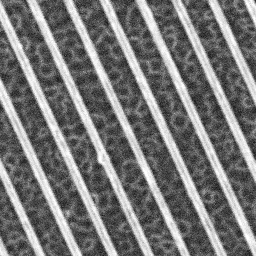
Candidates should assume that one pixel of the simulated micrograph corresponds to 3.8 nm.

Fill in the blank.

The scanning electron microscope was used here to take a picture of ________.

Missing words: parallel lines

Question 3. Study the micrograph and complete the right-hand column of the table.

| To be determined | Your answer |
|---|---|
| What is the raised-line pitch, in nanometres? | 125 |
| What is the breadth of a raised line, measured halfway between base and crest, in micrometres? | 0.0311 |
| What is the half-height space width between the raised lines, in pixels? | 24.6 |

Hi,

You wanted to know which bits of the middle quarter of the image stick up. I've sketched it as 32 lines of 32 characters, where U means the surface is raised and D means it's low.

UDDDDDDDUUDDDDDDDUUDDDDDDDUUDDDD
UDDDDDDDUUDDDDDDDUUDDDDDDDUUDDDD
UDDDDDDDDUDDDDDDDDUUDDDDDDDUUDDD
UUDDDDDDDUUDDDDDDDUUDDDDDDDUUDDD
UUDDDDDDDUUDDDDDDDUUUDDDDDDUUUDD
DUUDDDDDDDUUDDDDDDDUUDDDDDDDUUDD
DUUDDDDDDDUUDDDDDDDUUUDDDDDDUUUD
DDUUDDDDDDDUUDDDDDDDUUDDDDDDDUUD
DDUUDDDDDDDUUDDDDDDDUUDDDDDDDUUD
DDDUUDDDDDDDUUDDDDDDDUUDDDDDDDUU
DDDUUDDDDDDDUUDDDDDDDUUDDDDDDDUU
DDDUUUDDDDDDDUUDDDDDDDUUDDDDDDDU
DDDDUUDDDDDDDUUDDDDDDDUUDDDDDDDU
DDDDUUUDDDDDDDUUDDDDDDDUUDDDDDDD
DDDDDUUDDDDDDDUUDDDDDDDUUDDDDDDD
DDDDDUUDDDDDDDDUDDDDDDDDUUDDDDDD
DDDDDDUUDDDDDDDUUDDDDDDDUUDDDDDD
DDDDDDUUDDDDDDDUUDDDDDDDUUUDDDDD
DDDDDDDUUDDDDDDDUUDDDDDDDUUDDDDD
DDDDDDDUUDDDDDDDUUDDDDDDDUUUDDDD
UDDDDDDDUUDDDDDDDUUDDDDDDDUUDDDD
UDDDDDDDUUDDDDDDDUUDDDDDDDUUDDDD
UUDDDDDDDUUDDDDDDDUUDDDDDDDUUDDD
UUDDDDDDDUUDDDDDDDUUDDDDDDDUUDDD
UUUDDDDDDUUUDDDDDDDUUDDDDDDDUUDD
DUUDDDDDDDUUDDDDDDDUUDDDDDDDUUDD
DUUUDDDDDDUUDDDDDDDDUDDDDDDDDUUD
DDUUDDDDDDDUUDDDDDDDUUDDDDDDDUUD
DDUUDDDDDDDUUDDDDDDDDUDDDDDDDDUU
DDDUUDDDDDDDUUDDDDDDDUUDDDDDDDUU
DDDUUDDDDDDDUUDDDDDDDUUDDDDDDDUU
DDDDUUDDDDDDDUUDDDDDDDUUDDDDDDDU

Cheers